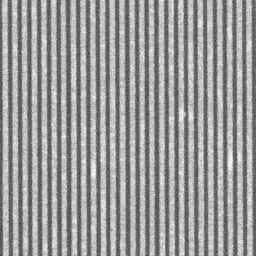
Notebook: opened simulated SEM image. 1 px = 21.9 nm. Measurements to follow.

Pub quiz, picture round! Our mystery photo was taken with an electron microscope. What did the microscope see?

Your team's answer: parallel lines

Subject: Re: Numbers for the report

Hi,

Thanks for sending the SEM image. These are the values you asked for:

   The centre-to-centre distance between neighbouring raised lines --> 0.214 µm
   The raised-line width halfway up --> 5.13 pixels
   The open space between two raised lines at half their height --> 101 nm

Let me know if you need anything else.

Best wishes